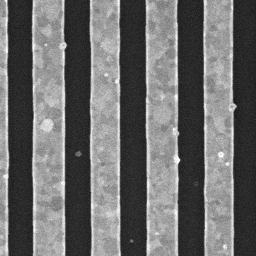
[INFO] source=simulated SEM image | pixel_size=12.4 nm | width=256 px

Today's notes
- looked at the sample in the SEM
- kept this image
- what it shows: wiring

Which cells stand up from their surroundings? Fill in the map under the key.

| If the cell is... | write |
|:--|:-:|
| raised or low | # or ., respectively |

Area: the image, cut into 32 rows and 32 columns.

#...####...####...####....###...
#...####...####...####....###...
#...####...####...####....###...
#...####...####...####....###...
#...####...####...####....###...
#...####...####...####....###...
#...####....###...####....###...
#...####....###...####....###...
#...####....###...####....###...
#...####...####...####....###...
#...####...####...####....###...
#...####...####...####....###...
#...####...####...####....###...
#...####...####...####....###...
#...####...####...####....###...
#...####...####...####....###...
#...####...####...####....###...
#...####...####...####....###...
#...####...####...####....###...
#...####...####...####....###...
#...####...####...####....###...
#...####...####...####....###...
#...####...####...####....###...
#...####...####....###....###...
#...####....###....###....###...
#...####....###...####....###...
#...####....###...####....###...
#...####....###...####....###...
#...####....###...####....###...
#...####....###....###....###...
#...####....###...####....###...
#...####....###...####....###...